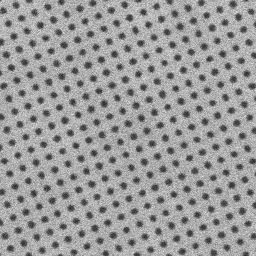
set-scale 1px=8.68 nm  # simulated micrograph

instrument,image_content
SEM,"a regular array of holes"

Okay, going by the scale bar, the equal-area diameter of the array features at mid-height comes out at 0.065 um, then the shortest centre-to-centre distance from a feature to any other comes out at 119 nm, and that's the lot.